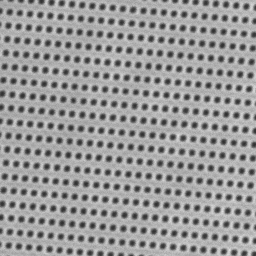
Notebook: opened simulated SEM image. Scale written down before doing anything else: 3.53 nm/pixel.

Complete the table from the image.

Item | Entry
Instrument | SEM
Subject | a regular array of holes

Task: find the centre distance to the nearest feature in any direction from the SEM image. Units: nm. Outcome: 35.8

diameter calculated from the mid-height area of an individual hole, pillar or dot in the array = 24.9 nm